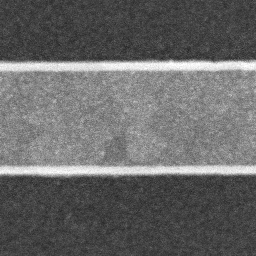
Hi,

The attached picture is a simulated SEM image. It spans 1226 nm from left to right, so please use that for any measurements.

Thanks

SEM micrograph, one or a few lines or trenches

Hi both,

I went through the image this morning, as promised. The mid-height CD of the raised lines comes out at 504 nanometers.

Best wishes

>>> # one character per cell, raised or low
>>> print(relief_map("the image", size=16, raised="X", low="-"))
----------------
----------------
----------------
----------------
XXXXXXXXXXXXXXXX
XXXXXXXXXXXXXXXX
XXXXXXXXXXXXXXXX
XXXXXXXXXXXXXXXX
XXXXXXXXXXXXXXXX
XXXXXXXXXXXXXXXX
XXXXXXXXXXXXXXXX
----------------
----------------
----------------
----------------
----------------